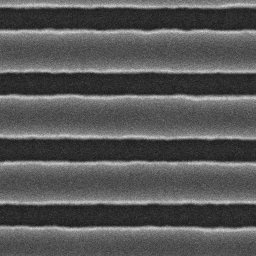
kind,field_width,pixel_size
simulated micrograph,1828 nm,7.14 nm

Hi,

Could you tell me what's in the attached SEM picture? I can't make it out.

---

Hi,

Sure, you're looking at lines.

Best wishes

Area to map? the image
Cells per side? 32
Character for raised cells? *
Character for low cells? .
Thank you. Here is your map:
********************************
................................
................................
................................
********************************
********************************
********************************
********************************
********************************
................................
................................
................................
********************************
********************************
********************************
********************************
********************************
................................
................................
................................
********************************
********************************
********************************
********************************
********************************
....*...........................
................................
................................
*************************.....**
********************************
********************************
********************************